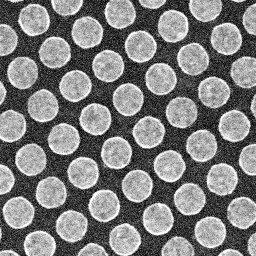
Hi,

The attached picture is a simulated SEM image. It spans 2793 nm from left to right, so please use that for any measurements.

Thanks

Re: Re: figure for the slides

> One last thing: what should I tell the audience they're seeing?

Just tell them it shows a regular array of raised bodies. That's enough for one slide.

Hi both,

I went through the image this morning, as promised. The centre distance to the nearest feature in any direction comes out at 414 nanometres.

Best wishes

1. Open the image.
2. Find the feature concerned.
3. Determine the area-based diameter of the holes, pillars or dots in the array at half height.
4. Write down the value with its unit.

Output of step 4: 332 nanometres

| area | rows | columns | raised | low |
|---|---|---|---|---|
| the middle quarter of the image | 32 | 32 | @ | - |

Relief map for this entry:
-------@@@@@@@@-------@@@@---@@@
-------@@@@@@@@------@@@@@@---@@
-@@@@---@@@@@@-------@@@@@@@---@
@@@@@@---@@@@--------@@@@@@@----
@@@@@@---------------@@@@@@@----
@@@@@@@-------@@@@---@@@@@@@----
@@@@@@-------@@@@@@---@@@@@-----
@@@@@@------@@@@@@@-------------
@@@@@-------@@@@@@@@------------
------------@@@@@@@@-------@@@@@
------@@@@---@@@@@@-------@@@@@@
-----@@@@@@--@@@@@@-------@@@@@@
----@@@@@@@----@@---------@@@@@@
----@@@@@@@@--------@@----@@@@@@
----@@@@@@@@-------@@@@@--@@@@@@
@----@@@@@@-------@@@@@@@---@@@-
@@@--@@@@@@------@@@@@@@@-------
@@@----@---------@@@@@@@@-------
@@@@--------@@----@@@@@@@------@
@@@@------@@@@@@--@@@@@@-------@
@@@-------@@@@@@---@@@@--------@
@@@-------@@@@@@@--------------@
----------@@@@@@@-------@@@@@---
----------@@@@@@@------@@@@@@---
--@@@@@@--@@@@@@-------@@@@@@@--
-@@@@@@@---@@@@--------@@@@@@@--
-@@@@@@@---------------@@@@@@@--
-@@@@@@@--------@@@@@--@@@@@@---
-@@@@@@@-------@@@@@@@--@@@@@---
--@@@@@@-------@@@@@@@----------
---@@@@--------@@@@@@@--------@@
---------------@@@@@@@-------@@@